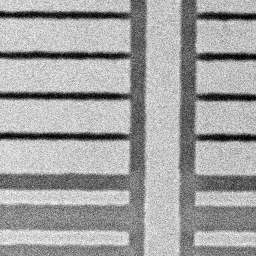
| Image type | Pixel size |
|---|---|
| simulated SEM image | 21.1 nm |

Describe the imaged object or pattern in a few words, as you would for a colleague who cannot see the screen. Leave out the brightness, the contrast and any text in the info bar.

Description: groups of lines, slits or small figures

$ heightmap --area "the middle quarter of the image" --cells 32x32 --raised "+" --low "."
++++++++++++++++.....++++++++...
++++++++++++++++.....++++++++...
++++++++++++++++.....++++++++...
++++++++++++++++.....++++++++...
++++++++++++++++.....++++++++...
++++++++++++++++.....++++++++...
++++++++++++++++.....++++++++...
.....................++++++++...
.....................++++++++...
++++++++++++++++.....++++++++...
++++++++++++++++.....++++++++...
++++++++++++++++.....++++++++...
++++++++++++++++.....++++++++...
++++++++++++++++.....++++++++...
++++++++++++++++.....++++++++...
++++++++++++++++.....++++++++...
++++++++++++++++.....++++++++...
.....................++++++++...
.....................++++++++...
++++++++++++++++.....++++++++...
++++++++++++++++....+++++++++...
++++++++++++++++....+++++++++...
++++++++++++++++....+++++++++...
++++++++++++++++.....++++++++...
++++++++++++++++.....++++++++...
++++++++++++++++.....+++++++....
++++++++++++++++.....+++++++....
.....................++++++++...
.....................++++++++...
....................+++++++++...
.....................++++++++...
.....................++++++++...